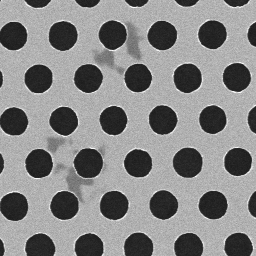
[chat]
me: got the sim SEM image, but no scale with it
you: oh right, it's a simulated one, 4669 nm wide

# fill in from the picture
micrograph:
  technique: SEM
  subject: a regular array of holes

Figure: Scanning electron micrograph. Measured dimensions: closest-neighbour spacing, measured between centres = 890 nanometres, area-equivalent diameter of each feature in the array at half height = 524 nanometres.